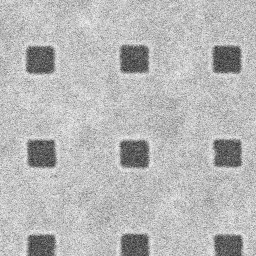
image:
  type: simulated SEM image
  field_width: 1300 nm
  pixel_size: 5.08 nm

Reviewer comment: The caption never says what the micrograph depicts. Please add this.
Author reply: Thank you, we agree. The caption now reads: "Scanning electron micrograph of holes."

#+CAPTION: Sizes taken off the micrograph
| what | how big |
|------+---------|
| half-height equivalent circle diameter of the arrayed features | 166 nm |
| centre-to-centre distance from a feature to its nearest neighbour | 92.6 px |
